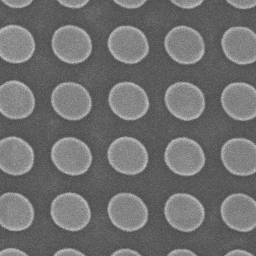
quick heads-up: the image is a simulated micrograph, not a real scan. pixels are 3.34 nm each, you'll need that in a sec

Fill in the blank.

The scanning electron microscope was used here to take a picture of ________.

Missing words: a regular array of raised bodies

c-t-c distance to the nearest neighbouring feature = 186 nm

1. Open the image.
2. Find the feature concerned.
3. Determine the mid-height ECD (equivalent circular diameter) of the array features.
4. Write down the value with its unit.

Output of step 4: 128 nm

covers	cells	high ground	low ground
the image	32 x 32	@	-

-@@@----@@@----@@@----@@@----@@@
--------------------------------
--------------------------------
-@@-----@@-----@@-----@@-----@@-
@@@@---@@@@---@@@@---@@@@---@@@@
@@@@---@@@@---@@@@---@@@@---@@@@
@@@@---@@@@---@@@@---@@@@---@@@@
-@@-----@@-----@@@----@@@----@@@
--------------------------------
--------------------------------
@@@-----@------@@-----@@-----@--
@@@@---@@@@---@@@@---@@@@---@@@@
@@@@---@@@@---@@@@---@@@@@--@@@@
@@@@---@@@@---@@@@---@@@@@--@@@@
-@@-----@@@----@@@----@@@----@@@
--------------------------------
--------------------------------
@@@-----@@-----@@-----@@-----@@-
@@@@---@@@@---@@@@---@@@@---@@@@
@@@@--@@@@@---@@@@---@@@@---@@@@
@@@@---@@@@---@@@@---@@@@---@@@@
-@@-----@@-----@@-----@@@----@@@
--------------------------------
--------------------------------
@@@----@@@----@@@-----@@-----@@-
@@@@---@@@@---@@@@---@@@@---@@@@
@@@@--@@@@@---@@@@---@@@@---@@@@
@@@@---@@@@---@@@@---@@@@---@@@@
-@@-----@@-----@@-----@@@----@@@
--------------------------------
--------------------------------
@@@----@@@-----@@-----@@-----@@-